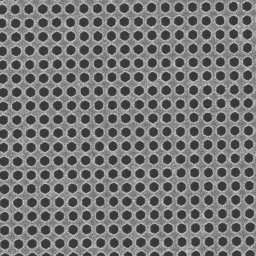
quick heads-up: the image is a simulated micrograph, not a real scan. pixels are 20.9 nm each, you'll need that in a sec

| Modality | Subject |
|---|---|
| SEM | a regular array of holes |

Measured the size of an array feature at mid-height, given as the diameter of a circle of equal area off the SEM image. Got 0.201 micrometres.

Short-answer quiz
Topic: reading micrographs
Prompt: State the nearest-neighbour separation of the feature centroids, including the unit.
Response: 276 nm